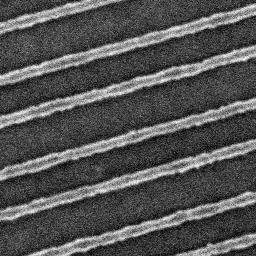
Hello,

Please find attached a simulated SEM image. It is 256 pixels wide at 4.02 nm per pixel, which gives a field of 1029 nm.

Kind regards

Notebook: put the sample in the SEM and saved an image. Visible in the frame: parallel lines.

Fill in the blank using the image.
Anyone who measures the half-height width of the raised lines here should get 36.3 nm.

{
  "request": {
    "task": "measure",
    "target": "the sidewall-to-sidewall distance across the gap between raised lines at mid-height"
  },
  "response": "152 nm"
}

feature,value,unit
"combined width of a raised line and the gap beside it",181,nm